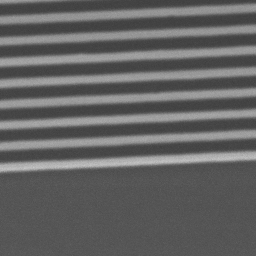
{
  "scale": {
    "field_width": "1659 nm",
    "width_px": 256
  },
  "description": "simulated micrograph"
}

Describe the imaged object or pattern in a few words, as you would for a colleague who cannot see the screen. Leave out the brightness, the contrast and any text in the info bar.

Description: parallel lines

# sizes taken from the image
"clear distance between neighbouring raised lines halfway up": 94.6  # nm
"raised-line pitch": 136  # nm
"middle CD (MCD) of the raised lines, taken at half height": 44.5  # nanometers